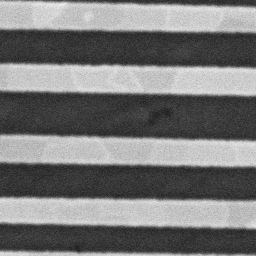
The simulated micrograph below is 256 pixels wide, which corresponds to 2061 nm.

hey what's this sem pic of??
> lines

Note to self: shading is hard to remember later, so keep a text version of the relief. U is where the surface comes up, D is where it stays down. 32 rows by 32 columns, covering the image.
UUUUUUUUUUUDDDDDDDDDDDDDDDDDDDDD
UUUUUUUUUUUUUUUUUUUUUUUUUUUUUUUU
UUUUUUUUUUUUUUUUUUUUUUUUUUUUUUUU
UUUUUUUUUUUUUUUUUUUUUUUUUUUUUUUU
DDDDDDDDDDDDDDDDDDDDDDDDDDDDDDDD
DDDDDDDDDDDDDDDDDDDDDDDDDDDDDDDD
DDDDDDDDDDDDDDDDDDDDDDDDDDDDDDDD
DDDDDDDDDDDDDDDDDDDDDDDDDDDDDDDD
UUUUUUUUUUUUUUUUUUUUUUUDDDDDDDDD
UUUUUUUUUUUUUUUUUUUUUUUUUUUUUUUU
UUUUUUUUUUUUUUUUUUUUUUUUUUUUUUUU
DDDDDDDDDDDDDDUUUUUUUUUUUUUUUUUU
DDDDDDDDDDDDDDDDDDDDDDDDDDDDDDDD
DDDDDDDDDDDDDDDDDDDDDDDDDDDDDDDD
DDDDDDDDDDDDDDDDDDDDDDDDDDDDDDDD
DDDDDDDDDDDDDDDDDDDDDDDDDDDDDDDD
DDDDDDDDDDDDDDDDDDDDDDDDDDDDDDDD
UUUUUUUUUUUUUUUUUUUUUDDDDDDDDDDD
UUUUUUUUUUUUUUUUUUUUUUUUUUUUUUUU
UUUUUUUUUUUUUUUUUUUUUUUUUUUUUUUU
DDDDDDDDDDDDDDDDDDDDDUUUUUUUUUUU
DDDDDDDDDDDDDDDDDDDDDDDDDDDDDDDD
DDDDDDDDDDDDDDDDDDDDDDDDDDDDDDDD
DDDDDDDDDDDDDDDDDDDDDDDDDDDDDDDD
DDDDDDDDDDDDDDDDDDDDDDDDDDDDDDDD
UUUUUUUUUUUUUUUUUUUUUUUUUUUUUUUU
UUUUUUUUUUUUUUUUUUUUUUUUUUUUUUUU
UUUUUUUUUUUUUUUUUUUUUUUUUUUUUUUU
DDDDDDDDDDDDDDDDDDDDDDDDDDDDDDDD
DDDDDDDDDDDDDDDDDDDDDDDDDDDDDDDD
DDDDDDDDDDDDDDDDDDDDDDDDDDDDDDDD
DDDDDDDDDDDDDDDDDDDDDDDDDDDDDDDD